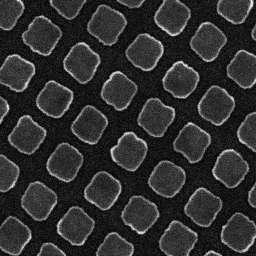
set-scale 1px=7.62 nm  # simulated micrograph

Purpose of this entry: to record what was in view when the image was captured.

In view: a regular array of raised bodies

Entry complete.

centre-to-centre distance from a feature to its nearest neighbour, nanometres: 339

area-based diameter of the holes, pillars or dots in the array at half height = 34.9 pixels